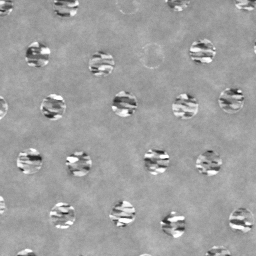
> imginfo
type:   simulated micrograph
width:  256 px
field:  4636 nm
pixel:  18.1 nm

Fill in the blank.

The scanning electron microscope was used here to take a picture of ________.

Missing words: a regular array of raised bodies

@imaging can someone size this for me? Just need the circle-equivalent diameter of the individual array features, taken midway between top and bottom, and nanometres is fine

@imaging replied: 448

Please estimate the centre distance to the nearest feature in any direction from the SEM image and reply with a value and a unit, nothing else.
942 nm